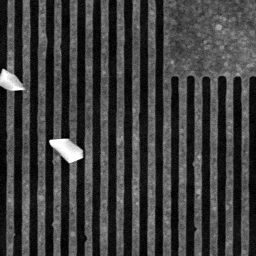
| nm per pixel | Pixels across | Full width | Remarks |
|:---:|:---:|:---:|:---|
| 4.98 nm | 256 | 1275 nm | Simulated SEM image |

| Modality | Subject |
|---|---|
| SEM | parallel lines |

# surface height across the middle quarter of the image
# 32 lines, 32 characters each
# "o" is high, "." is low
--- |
..o..oo..oo..oo..oo..oo..ooooooo
.oo..oo..oo..oo..oo..oo..ooooooo
.oo..oo..oo..oo..oo..oo..ooooooo
..o..oo..oo..oo..oo..oo..oo..oo.
..o..oo..oo..oo..oo..oo..oo..oo.
..o..oo..oo..oo..oo..oo..oo..oo.
..o..oo..oo..oo..oo..oo..oo..oo.
..o..oo..oo..oo..oo..oo..oo..oo.
..o..oo..oo..oo..oo..oo..oo..oo.
..o..oo..oo..oo..oo..oo..oo..oo.
.oo..oo..oo..oo..oo..oo..oo..oo.
.oo..oo..oo..oo..oo..oo..oo..oo.
.oo..oo..oo..oo..oo..oo..oo..oo.
.oo..oo..oo..oo..oo..oo..oo..oo.
.oo..oo..oo..oo..oo..oo..oo..oo.
.oo..oo..oo..oo..oo..oo..oo..oo.
.oo..oo..oo..oo..oo..oo..oo..oo.
.oo..oo..oo..oo..oo..oo..oo..oo.
.oo..oo..oo..oo..oo..oo..oo..oo.
ooo..oo..oo..oo..oo..oo..oo..oo.
ooo..oo..oo..oo..oo..oo..oo..oo.
oooo.oo..oo..oo..oo..oo..oo..oo.
ooooooo..oo..oo..oo..oo..oo..oo.
oooo.oo..oo..oo..oo..oo..oo..oo.
.oo..oo..oo..oo..oo..oo..oo..oo.
.oo..oo..oo..oo..oo..oo..oo..oo.
.oo..oo..oo..oo..oo..oo..oo..oo.
.oo..oo..oo..oo..oo..oo..oo..oo.
.oo..oo..oo..oo..oo..oo..oo..oo.
.oo..oo..oo..oo..oo..oo..oo..oo.
.oo..oo..oo..oo..oo..oo..oo..oo.
.oo..oo..oo..oo..oo..oo..oo..o..